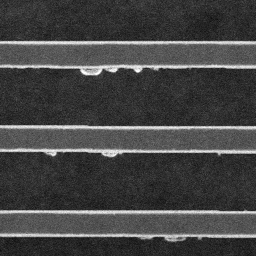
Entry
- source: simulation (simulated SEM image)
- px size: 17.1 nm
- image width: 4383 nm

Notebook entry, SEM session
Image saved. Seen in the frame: lines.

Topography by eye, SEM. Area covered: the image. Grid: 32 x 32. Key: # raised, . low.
................................
................................
................................
................................
................................
################################
################################
################################
................................
................................
................................
................................
................................
................................
................................
................................
################################
################################
################################
................................
................................
................................
................................
................................
................................
................................
################################
################################
################################
......##########################
................................
................................